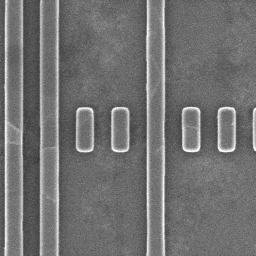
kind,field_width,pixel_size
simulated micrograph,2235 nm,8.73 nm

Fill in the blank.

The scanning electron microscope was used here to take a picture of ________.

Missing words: wiring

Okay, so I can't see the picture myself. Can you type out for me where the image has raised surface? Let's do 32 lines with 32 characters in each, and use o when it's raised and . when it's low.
.oo..oo...........ooo...........
.oo..oo...........oo............
.oo..oo...........oo............
.oo..oo...........ooo...........
.oo..oo...........ooo...........
.oo..oo...........ooo...........
.oo..oo...........ooo...........
.oo..oo...........ooo...........
.oo..oo...........ooo...........
.oo..oo...........ooo...........
.oo..oo...........ooo...........
.oo..oo...........ooo...........
.oo..oo...........ooo...........
.oo..oo........o..ooo..o....o...
.oo..oo...oo..oo..ooo..oo..oo...
.oo..oo...oo..oo..ooo..oo..oo...
.oo..oo...oo..oo..oo...oo..oo...
.oo..oo...oo..oo..ooo..oo..oo...
.oo..oo...oo..oo..ooo..oo..oo...
.oo..oo...........ooo...........
.oo..oo...........ooo...........
.oo..oo...........ooo...........
.oo..oo...........oo............
.oo..oo...........oo............
.oo..oo...........oo............
.oo..oo...........oo............
.oo..oo...........oo............
.oo..oo...........oo............
.oo..oo...........oo............
.oo..oo...........ooo...........
.oo..oo...........ooo...........
.oo..oo...........ooo...........